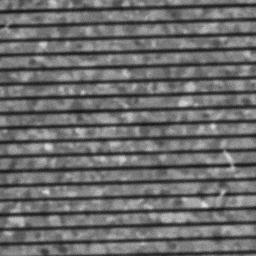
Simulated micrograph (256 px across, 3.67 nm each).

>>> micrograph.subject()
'parallel lines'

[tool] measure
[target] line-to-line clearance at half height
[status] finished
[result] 16.1 nanometers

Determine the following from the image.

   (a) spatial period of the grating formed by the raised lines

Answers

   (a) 0.0533 micrometres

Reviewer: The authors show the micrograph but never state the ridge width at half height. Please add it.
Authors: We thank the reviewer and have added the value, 38.1 nm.